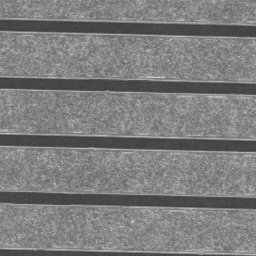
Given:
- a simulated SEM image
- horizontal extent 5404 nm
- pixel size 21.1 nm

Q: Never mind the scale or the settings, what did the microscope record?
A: parallel lines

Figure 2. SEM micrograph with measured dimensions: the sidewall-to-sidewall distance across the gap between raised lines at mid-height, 0.27 µm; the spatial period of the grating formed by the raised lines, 1210 nm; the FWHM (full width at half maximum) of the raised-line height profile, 934 nanometers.